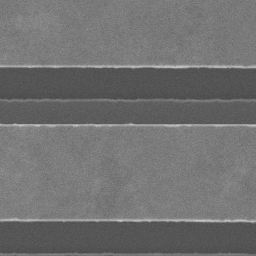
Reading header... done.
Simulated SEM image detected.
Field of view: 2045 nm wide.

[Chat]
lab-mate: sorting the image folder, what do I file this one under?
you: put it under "lines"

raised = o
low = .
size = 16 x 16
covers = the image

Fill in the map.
oooooooooooooooo
oooooooooooooooo
oooooooooooooooo
oooooooooooooooo
................
................
................
................
oooooooooooooooo
oooooooooooooooo
oooooooooooooooo
oooooooooooooooo
oooooooooooooooo
oooooooooooooooo
................
................